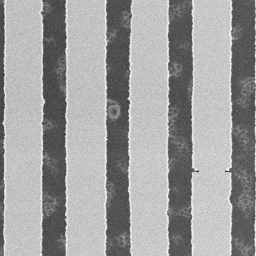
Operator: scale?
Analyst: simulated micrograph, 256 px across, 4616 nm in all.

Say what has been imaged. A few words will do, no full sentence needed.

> one or a few lines or trenches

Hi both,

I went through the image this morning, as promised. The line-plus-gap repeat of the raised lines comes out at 1130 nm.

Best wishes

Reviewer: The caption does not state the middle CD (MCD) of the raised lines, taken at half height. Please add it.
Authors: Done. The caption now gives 685 nanometres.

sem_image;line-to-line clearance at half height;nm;451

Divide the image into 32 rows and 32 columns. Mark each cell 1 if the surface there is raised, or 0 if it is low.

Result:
01111000111110001111100011111000
01111000111110001111100011111000
01111000111110001111100011111000
01111000111110001111100011111000
01111000111110001111100011111000
01111000111110001111100011111000
01111000111110001111100011111000
01111000111110001111100011111000
01111000111110001111100011111000
01111000111110001111100011111000
01111000111110001111100011111000
01111000111110001111100011111000
01111000111110001111100011111000
01111000111111101111100011111000
01111000111111101111100011111000
11111000111110001111100011111000
01111000111110001111100011111000
01111000111110001111100011111000
01111000111110001111100011111000
01111000111110001111100011111000
01111000111110001111100011111000
01111000111110001111100011111000
01111000111110001111100011111000
01111000111110001111100011111000
01111000111110001111100011111000
01111000111110001111100011111000
01111000111110001111100011111000
01111000111110001111100011111000
01111000111110001111100011111000
01111000111110001111100011111000
01111000111110001111100011111000
01111000111110001111100011111000